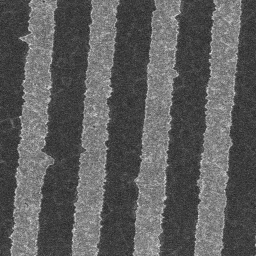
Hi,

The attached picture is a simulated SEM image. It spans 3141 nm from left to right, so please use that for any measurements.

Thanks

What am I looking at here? one or a few lines or trenches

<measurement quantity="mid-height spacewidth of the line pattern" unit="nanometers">442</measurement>